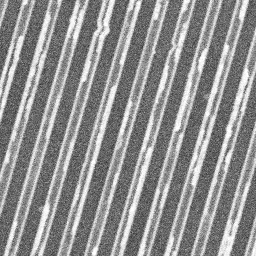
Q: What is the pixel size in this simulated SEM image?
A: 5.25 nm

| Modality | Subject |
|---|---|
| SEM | parallel lines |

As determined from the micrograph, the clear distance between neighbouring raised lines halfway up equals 0.0796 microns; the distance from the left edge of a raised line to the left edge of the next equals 0.135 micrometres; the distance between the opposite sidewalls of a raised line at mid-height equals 54.3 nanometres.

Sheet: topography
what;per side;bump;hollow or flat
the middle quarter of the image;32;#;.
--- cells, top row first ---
#....###....###....##.....##....
#....###....##....###....###....
#....##....###....###....##.....
.....##....###....##.....##....#
....###....##.....##....###....#
....##.....##....###....###....#
....##....###....###....##....##
...###....##.....##.....##....##
...###....##....###....###....##
...##....###....###....##.....##
...##....###....##.....##....###
..###....###....##....###....##.
..##.....##....###....###....##.
..##....###....###....##....###.
.###....###....##.....##....###.
.###....##....###....###....##..
.##....###....###....##.....##..
.##....###....##.....##....###..
###....###....##....###....##...
##.....##....###....###....##...
##....###....###....##....###...
##....###....##.....##....###...
##....##....###....###....##....
#.....##....###....##.....##....
#....###....##.....##....###....
#....###....##....###....##.....
.....##....###....###....##....#
....###....###....##....###....#
....###....##.....##....###....#
....##....###....###....##.....#
...###....###....##.....##....##
...###....##.....##....###....##